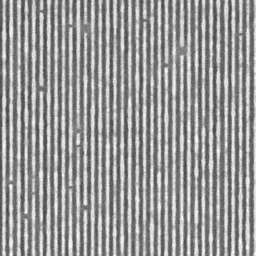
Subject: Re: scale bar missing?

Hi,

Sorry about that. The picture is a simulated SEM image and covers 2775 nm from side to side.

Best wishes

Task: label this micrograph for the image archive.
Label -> parallel lines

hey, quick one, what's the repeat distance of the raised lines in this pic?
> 0.0801 µm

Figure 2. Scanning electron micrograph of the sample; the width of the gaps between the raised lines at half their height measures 47.4 nm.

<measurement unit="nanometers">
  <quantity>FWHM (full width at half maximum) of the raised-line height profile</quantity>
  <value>28.4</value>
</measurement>